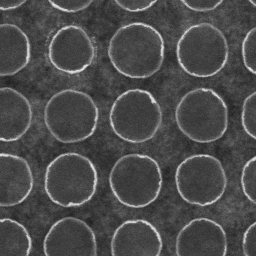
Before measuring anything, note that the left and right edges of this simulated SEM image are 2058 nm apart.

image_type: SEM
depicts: a regular array of raised bodies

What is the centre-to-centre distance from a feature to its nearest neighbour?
517 nanometers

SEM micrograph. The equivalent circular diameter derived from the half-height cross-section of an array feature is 413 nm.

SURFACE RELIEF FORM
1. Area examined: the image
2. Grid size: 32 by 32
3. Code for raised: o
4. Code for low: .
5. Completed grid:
ooo....oooo....oooo....oooo.....
................................
................................
oo......oo.....oooo.....ooo.....
ooo....oooo...oooooo...ooooo...o
oooo..ooooo...oooooo..oooooo..oo
oooo..oooooo..oooooo..oooooo..oo
ooo...ooooo...oooooo..oooooo...o
ooo....oooo....ooooo...ooooo...o
................oo.......o......
................................
oo......oo......oo......ooo.....
ooo...ooooo....oooo....ooooo...o
oooo..oooooo..oooooo..oooooo..oo
oooo..oooooo..oooooo..oooooo..oo
oooo..oooooo..oooooo..oooooo..oo
ooo...oooooo..ooooo....ooooo...o
oo......oo......oo......ooo.....
................................
o.......oo......oo.......o......
ooo...ooooo....ooooo...oooo....o
oooo..oooooo..oooooo..oooooo..oo
oooo..oooooo..oooooo..oooooo..oo
oooo..oooooo..oooooo..oooooo..oo
ooo...ooooo....ooooo...oooo....o
oo......oo......oo......oo......
................................
o.......oo..............oo......
ooo....oooo....oooo....ooooo...o
oooo..oooooo..oooooo..oooooo...o
oooo..oooooo..oooooo..oooooo...o
oooo..oooooo..oooooo..oooooo...o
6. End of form